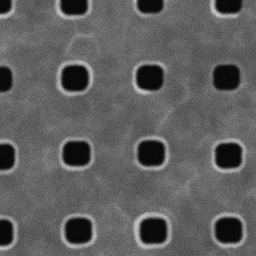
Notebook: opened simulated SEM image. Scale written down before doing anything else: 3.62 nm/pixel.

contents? a regular array of holes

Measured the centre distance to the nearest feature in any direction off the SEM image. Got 272 nm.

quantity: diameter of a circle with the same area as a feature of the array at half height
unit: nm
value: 101